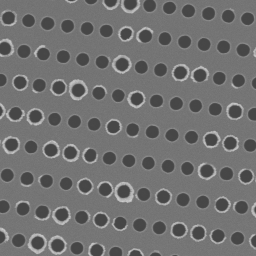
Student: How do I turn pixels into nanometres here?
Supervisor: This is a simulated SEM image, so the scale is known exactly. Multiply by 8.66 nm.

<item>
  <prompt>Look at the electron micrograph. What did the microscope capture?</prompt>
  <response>a regular array of holes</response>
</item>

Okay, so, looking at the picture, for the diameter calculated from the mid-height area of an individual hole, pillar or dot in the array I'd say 108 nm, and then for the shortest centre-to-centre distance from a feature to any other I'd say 170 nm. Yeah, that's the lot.